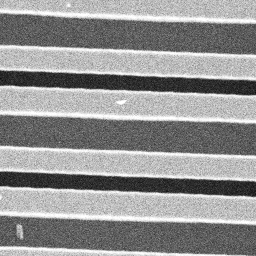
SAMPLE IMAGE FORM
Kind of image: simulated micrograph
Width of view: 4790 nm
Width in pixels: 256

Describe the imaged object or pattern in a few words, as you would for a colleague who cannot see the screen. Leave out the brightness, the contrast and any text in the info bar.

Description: lines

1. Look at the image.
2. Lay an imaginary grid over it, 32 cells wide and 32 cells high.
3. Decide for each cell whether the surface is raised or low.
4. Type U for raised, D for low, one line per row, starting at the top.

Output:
UUUUUUUUUUUUUUUUUUUUUUUUUUUUUUUU
DDUUUUUUUUUUUUUUUUUUUUUUUUUUUUUU
DDDDDDDDDDDDDDDDDDDDDDDDDDUUUUUU
DDDDDDDDDDDDDDDDDDDDDDDDDDDDDDDD
DDDDDDDDDDDDDDDDDDDDDDDDDDDDDDDD
DDDDDDDDDDDDDDDDDDDDDDDDDDDDDDDD
UUUUUUUUUUUUUUUUUUUUDDDDDDDDDDDD
UUUUUUUUUUUUUUUUUUUUUUUUUUUUUUUU
UUUUUUUUUUUUUUUUUUUUUUUUUUUUUUUU
DDDDDDDDDDDDDDDDDDDUUUUUUUUUUUUU
DDDDDDDDDDDDDDDDDDDDDDDDDDDDDDDD
UUUUUUUUUUUUUUUUUUUDDDDDDDDDDDDD
UUUUUUUUUUUUUUUUUUUUUUUUUUUUUUUU
UUUUUUUUUUUUUUUUUUUUUUUUUUUUUUUU
DDDDDDDDDDDDDUUUUUUUUUUUUUUUUUUU
DDDDDDDDDDDDDDDDDDDDDDDDDDDDDDDD
DDDDDDDDDDDDDDDDDDDDDDDDDDDDDDDD
DDDDDDDDDDDDDDDDDDDDDDDDDDDDDDDD
UUDDDDDDDDDDDDDDDDDDDDDDDDDDDDDD
UUUUUUUUUUUUUUUUUUUUUUUUUUUDDDDD
UUUUUUUUUUUUUUUUUUUUUUUUUUUUUUUU
DDDDDUUUUUUUUUUUUUUUUUUUUUUUUUUU
DDDDDDDDDDDDDDDDDDDDDDDDDDDDDUUU
UUDDDDDDDDDDDDDDDDDDDDDDDDDDDDDD
UUUUUUUUUUUUUUUUUUUUUUUUUUUUDDDD
UUUUUUUUUUUUUUUUUUUUUUUUUUUUUUUU
UUUUUUUUUUUUUUUUUUUUUUUUUUUUUUUU
DDDDDDDDDDDDDDDDDDDDDUUUUUUUUUUU
DDDDDDDDDDDDDDDDDDDDDDDDDDDDDDDD
DDDDDDDDDDDDDDDDDDDDDDDDDDDDDDDD
DDDDDDDDDDDDDDDDDDDDDDDDDDDDDDDD
UUUUUUUUUUUUUUDDDDDDDDDDDDDDDDDD